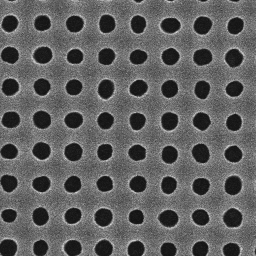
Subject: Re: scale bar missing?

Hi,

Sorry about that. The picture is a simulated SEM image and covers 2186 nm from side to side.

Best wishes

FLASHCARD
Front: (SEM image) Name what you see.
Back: a regular array of holes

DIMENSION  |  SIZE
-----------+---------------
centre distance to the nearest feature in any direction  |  268 nm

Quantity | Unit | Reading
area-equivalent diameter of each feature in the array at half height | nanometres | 148